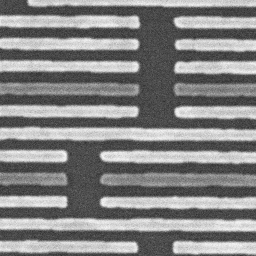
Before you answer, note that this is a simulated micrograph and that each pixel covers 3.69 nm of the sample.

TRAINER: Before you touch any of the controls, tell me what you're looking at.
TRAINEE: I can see wiring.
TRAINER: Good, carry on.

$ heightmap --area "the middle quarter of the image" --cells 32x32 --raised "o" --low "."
oooooooooooooooooo..........oooo
oooooooooooooooooo..........oooo
................................
................................
................................
oooooooooooooooooo..........oooo
oooooooooooooooooo..........oooo
............................oooo
................................
................................
................................
oooooooooooooooooo..........oooo
oooooooooooooooooo..........oooo
................................
................................
................................
ooooooooooooooooooooo...........
oooooooooooooooooooooooooooooooo
oooooooooooooooooooooooooooooooo
................................
................................
................................
..........oooooooooooooooooooooo
..........oooooooooooooooooooooo
................................
................................
................................
................................
..........oooooooooooooooooooooo
o.........oooooooooooooooooooooo
................................
................................